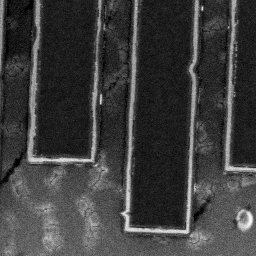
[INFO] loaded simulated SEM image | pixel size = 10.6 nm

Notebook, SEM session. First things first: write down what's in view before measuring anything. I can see one or a few lines or trenches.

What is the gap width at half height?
0.391 microns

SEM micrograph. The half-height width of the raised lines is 0.651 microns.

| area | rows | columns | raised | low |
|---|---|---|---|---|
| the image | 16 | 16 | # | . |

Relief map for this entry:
..####...###...#
..####..####...#
..####..####...#
..####..####..##
..####..####..##
..####..####..##
..####..####..##
..####..####..##
..####..####..##
..####..####..##
........####...#
........####....
........####....
........####....
................
................